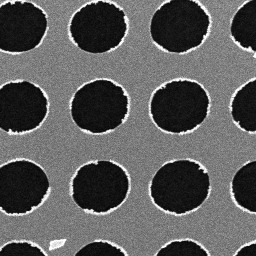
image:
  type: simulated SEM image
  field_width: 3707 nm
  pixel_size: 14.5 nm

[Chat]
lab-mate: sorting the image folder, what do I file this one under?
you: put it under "holes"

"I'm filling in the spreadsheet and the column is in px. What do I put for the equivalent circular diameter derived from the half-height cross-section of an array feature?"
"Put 54.5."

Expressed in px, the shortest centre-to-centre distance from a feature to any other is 79.9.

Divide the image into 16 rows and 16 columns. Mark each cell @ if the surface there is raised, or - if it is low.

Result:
--@@@--@@@---@@-
---@----@----@@-
---@@---@@---@@-
@@@@@@@@@@@@@@@@
@@@@@@@@@@@@@@@@
--@@@--@@@---@@-
---@@---@----@@-
---@@---@@---@@-
@@@@@@@@@@@@@@@@
@@@@@@@@@@@@@@@@
--@@@--@@@---@@-
---@@---@----@@-
---@@---@@---@@-
@@@@@@@@@@@@@@@@
@@@@@@@@@@@@@@@@
--@@@--@@@---@@-